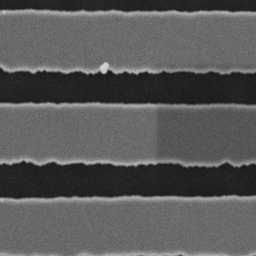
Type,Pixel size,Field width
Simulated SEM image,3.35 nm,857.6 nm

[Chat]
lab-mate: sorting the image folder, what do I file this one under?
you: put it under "lines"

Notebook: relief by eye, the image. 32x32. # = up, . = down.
................................
#######################.########
################################
################################
################################
################################
################################
################################
################################
................................
................................
................................
................................
################################
################################
################################
################################
################################
################################
################################
##..##.##..#..######..######.###
................................
................................
................................
................#...........##.#
################################
################################
################################
################################
################################
################################
################################